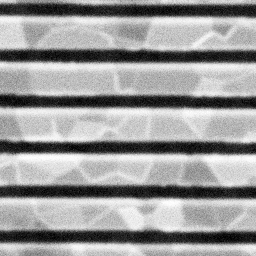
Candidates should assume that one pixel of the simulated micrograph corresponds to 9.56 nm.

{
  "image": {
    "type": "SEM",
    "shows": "lines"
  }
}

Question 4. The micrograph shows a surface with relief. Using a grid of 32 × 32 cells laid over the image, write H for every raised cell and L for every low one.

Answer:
LLLLLLLLLLLLLLLLLLLLLLLLLLLLLLLL
LLLLLLLLLLLLLLLLLLLLLLLLLLLLLLLL
LLLLLLLLLLLLLLLLLLLLLLLLLLLLLLLL
HHHHHHHHHHHHHHHHHHHHHHHHHHHHHHHH
HHHHHHHHHHHHHHHHHHHHHHHHHHHHHHHH
HHHHHHHHHHHHHHHHHHHHHHHHHHHHHHHH
LLLLLLLLLLLLLLLLLLLLLLLLLLLLLLLL
LLLLLLLLLLLLLLLLLLLLLLLLLLLLLLLL
HHHHHHHHHHHHHHHHHHHHHHHHHHHHHHHH
HHHHHHHHHHHHHHHHHHHHHHHHHHHHHHHH
HHHHHHHHHHHHHHHHHHHHHHHHHHHHHHHH
HHHHHHHHHHHHHHHHHHHHHHHHHHHHHHHH
LLLLLLLLLLLLLLLLLLLLLLLLLLLLLLLL
LLLLLLLLLLLLLLLLLLLLLLLLLLLLLLLL
HHHHHHHHHHHHHHHHHHHHHHHHHHHHHHHH
HHHHHHHHHHHHHHHHHHHHHHHHHHHHHHHH
HHHHHHHHHHHHHHHHHHHHHHHHHHHHHHHH
LHHHHHHHHHHHHHHHHHHHHHHHHHHHHHHH
LLLLLLLLLLLLLLLLLLLLLLLLLLLLLLLL
LLLLLLLLLLLLLLLLLLLLLLLLLLLLLLLL
HHHHHHHHHHHHHHHHHHHHHHHHHHHHHHHH
HHHHHHHHHHHHHHHHHHHHHHHHHHHHHHHH
HHHHHHHHHHHHHHHHHHHHHHHHHHHHHHHH
LLLLLLLLLLLLLLLLLLLLLLLLLLLLLLLL
LLLLLLLLLLLLLLLLLLLLLLLLLLLLLLLL
HHHHHHHHHHHHHHHHHHHHHHHHHHHHHHHH
HHHHHHHHHHHHHHHHHHHHHHHHHHHHHHHH
HHHHHHHHHHHHHHHHHHHHHHHHHHHHHHHH
HHHHHHHHHHHHHHHHHHHHHHHHHHHHHHHH
LLLLLLLLLLLLLLLLLLLLLLLLLLLLLLLL
LLLLLLLLLLLLLLLLLLLLLLLLLLLLLLLL
HHHHHHHHHHHHHHHHHHHHHHHHHHHHHHHH